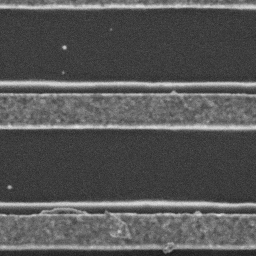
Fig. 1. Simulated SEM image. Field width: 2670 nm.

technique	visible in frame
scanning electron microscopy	lines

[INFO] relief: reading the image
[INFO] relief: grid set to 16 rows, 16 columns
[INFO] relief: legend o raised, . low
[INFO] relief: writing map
................
................
................
................
................
oooooooooooooooo
oooooooooooooooo
oooooooooooooooo
................
................
................
................
................
oooooooooooooooo
oooooooooooooooo
..........o.....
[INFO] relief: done